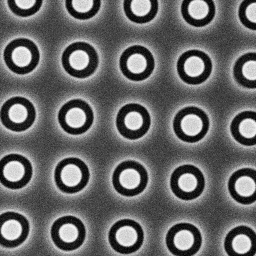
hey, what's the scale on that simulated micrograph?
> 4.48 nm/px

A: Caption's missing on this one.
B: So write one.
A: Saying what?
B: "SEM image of an array of small figures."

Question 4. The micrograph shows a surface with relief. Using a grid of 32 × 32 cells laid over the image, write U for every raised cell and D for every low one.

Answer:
UDDDDUUUDDDDDUUDDDDDUUUDDDDUUUDD
UDDDDUUUDDDDUUUUDDDDUUUDDDDUUUDD
UUUUUUUUUUUUUUUUDDDUUUUDDDDUUUDD
UUUUUUUUUUUUUUUUUUUUUUUUUUUUUUUD
UUUUUUUUUUUUUUUUUUUUUUUUUUUUUUUU
UDDDUUUUUDDUUUUUUUUUUUUUUUUUUUUU
DDDDDUUUDDDDUUUDDDDUUUUDDDUUUUUD
DDDDDUUUDDDDUUUDDDDUUUDDDDUUUUDD
UDDDUUUUDDDDUUUDDDDUUUDDDDDUUDDD
UUUUUUUUUDDUUUUUDDDUUUDDDDUUUDDD
UUUUUUUUUUUUUUUUUUUUUUUDDUUUUUDD
UUUUUUUUUUUUUUUUUUUUUUUUUUUUUUUU
UDDDUUUUUDUUUUUUUUUUUUUUUUUUUUUU
DDDDUUUUDDDUUUUDDDUUUUUDDUUUUUUU
DDDDUUUDDDDDUUUDDDDUUUDDDDUUUDDD
DDDDUUUDDDDDUUDDDDDUUUDDDDUUUDDD
UUDUUUUUDDDUUUUDDDUUUUDDDDUUUDDD
UUUUUUUUUUUUUUUUUUUUUUUDDUUUUDDD
UUUUUUUUUUUUUUUUUUUUUUUUUUUUUUUU
UDDUUUUUUUUUUUUUUUUUUUUUUUUUUUUU
DDDDUUUDDDDUUUUDDDUUUUUUUUUUUUUU
DDDDUUUDDDDUUUDDDDUUUUDDDUUUUDDD
DDDDUUUDDDDUUUDDDDDUUDDDDDUUUDDD
UDDUUUUDDDUUUUDDDDUUUDDDDDUUUDDD
UUUUUUUUUUUUUUUDDUUUUUDDDUUUUDDD
UUUUUUUUUUUUUUUUUUUUUUUUUUUUUUDU
UDUUUUUUUUUUUUUUUUUUUUUUUUUUUUUU
DDDUUUUDDDUUUUUDDUUUUUUUUUUUUUUU
DDDDUUDDDDDUUUDDDDUUUDDDDUUUUDDU
DDDDUUDDDDDUUUDDDDUUUDDDDUUUDDDD
DDDUUUUDDDUUUUDDDDUUUDDDDUUUDDDD
UUUUUUUUUUUUUUUDDUUUUDDDDUUUDDDD